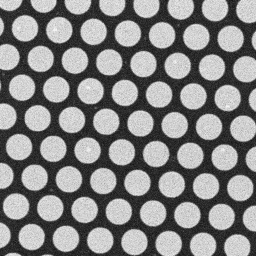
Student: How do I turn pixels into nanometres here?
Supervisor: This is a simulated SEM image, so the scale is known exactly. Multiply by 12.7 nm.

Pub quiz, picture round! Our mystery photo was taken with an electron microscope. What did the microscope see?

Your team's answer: an array of small figures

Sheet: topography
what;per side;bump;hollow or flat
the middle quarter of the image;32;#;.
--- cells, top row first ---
######..######...######..#######
.####....#####...######..######.
..........###.....####....#####.
............................##..
#...#####....####...............
#...#####...######...#####.....#
#..#######..######...######...##
#...######..######...######..###
#...#####...######...######..###
.....###.....#####...#####....##
......................###.....##
####.....###....................
#####...#####....####.....###...
#####...######..######...#####..
#####...######..######...######.
#####..#######..######...######.
####....#####...######...######.
...........#.....####....#####..
................................
....####.....###......##........
...######...#####....####.....##
#..######..#######..######...###
...######..#######..######..####
...######...#####...######..####
.....##.....#####...######...###
......................##......##
###.....####....................
####...#####....#####....####...
####...######..######...######..
####...######..######...######..
####...######..######...######..
###.....####....#####...######..